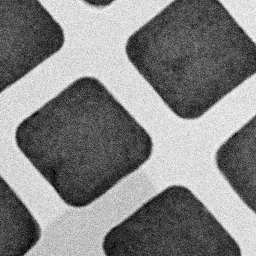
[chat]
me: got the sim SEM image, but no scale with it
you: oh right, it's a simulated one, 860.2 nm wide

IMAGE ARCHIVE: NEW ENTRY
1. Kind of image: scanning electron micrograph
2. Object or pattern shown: holes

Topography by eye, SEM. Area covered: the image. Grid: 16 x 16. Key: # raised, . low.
...#######....##
....#####......#
....####........
...#####........
..#######.......
####...###.....#
###.....##....##
##......########
#........#####..
#.........####..
##.......#####..
.##....#######..
.###..###...###.
..######.....###
...####.......##
..####.........#